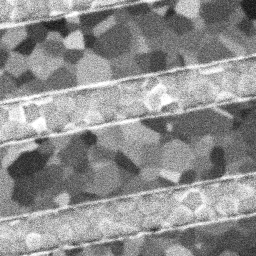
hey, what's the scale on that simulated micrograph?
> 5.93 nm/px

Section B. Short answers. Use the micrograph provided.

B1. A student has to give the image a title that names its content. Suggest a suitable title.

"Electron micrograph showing one or a few lines or trenches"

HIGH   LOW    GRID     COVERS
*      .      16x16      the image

......**********
.***************
****************
****************
**********......
*****...........
..............**
........********
...*************
****************
****************
************....
*******.........
**.............*
..........******
....************